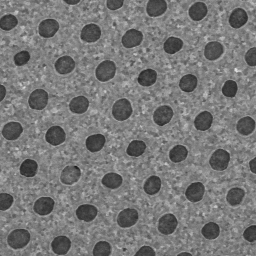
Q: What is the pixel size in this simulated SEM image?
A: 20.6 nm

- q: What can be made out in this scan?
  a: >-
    a regular array of holes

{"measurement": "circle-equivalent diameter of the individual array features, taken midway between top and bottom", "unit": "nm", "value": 411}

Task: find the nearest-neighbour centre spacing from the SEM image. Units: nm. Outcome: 838